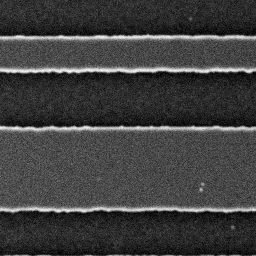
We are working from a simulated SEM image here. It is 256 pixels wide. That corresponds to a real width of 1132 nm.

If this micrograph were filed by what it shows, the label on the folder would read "lines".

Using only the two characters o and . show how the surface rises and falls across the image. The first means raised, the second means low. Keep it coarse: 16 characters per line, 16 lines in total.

................
................
oooooooooooooooo
oooooooooooooooo
.oo.o.......o...
................
................
................
oooooooooooooooo
oooooooooooooooo
oooooooooooooooo
oooooooooooooooo
oooooooooooooooo
................
................
................